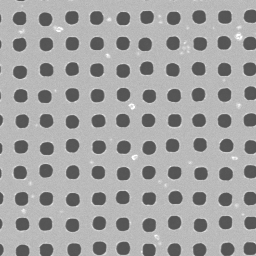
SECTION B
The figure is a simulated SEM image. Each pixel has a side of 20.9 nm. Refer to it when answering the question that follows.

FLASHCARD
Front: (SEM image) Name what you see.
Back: a regular array of holes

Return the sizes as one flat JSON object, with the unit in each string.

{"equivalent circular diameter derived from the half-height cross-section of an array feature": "294 nanometres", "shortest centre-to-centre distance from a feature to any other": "512 nanometres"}